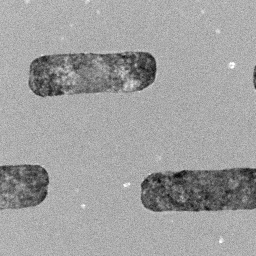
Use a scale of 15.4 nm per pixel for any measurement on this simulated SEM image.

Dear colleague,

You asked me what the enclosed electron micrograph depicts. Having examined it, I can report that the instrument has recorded holes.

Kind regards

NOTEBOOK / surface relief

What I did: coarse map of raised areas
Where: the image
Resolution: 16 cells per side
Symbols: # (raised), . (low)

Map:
################
################
################
###......#######
##........######
##.......#######
################
################
################
################
...############.
...######.......
...######.......
################
################
################